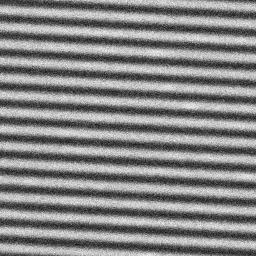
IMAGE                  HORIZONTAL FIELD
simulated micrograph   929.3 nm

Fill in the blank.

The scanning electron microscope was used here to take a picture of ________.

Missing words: parallel lines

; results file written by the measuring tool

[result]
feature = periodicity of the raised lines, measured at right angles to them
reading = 61.6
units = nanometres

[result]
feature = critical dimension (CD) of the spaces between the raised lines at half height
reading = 10.2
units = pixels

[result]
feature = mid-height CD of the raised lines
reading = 24.9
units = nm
